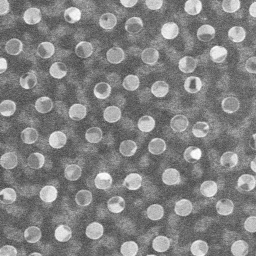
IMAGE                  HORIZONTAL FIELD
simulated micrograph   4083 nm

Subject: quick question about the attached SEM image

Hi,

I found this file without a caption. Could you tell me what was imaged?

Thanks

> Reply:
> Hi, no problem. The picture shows a regular array of raised bodies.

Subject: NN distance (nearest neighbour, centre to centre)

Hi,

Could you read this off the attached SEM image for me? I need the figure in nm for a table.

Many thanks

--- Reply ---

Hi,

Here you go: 450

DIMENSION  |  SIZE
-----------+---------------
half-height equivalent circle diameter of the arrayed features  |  258 nm